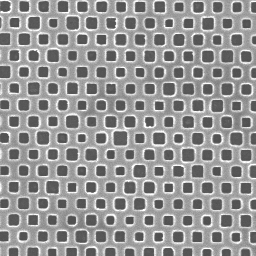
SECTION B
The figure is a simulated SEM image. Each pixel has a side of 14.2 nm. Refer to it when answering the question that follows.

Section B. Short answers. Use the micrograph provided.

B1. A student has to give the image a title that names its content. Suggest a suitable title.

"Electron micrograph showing a regular array of holes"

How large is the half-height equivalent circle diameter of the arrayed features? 159 nm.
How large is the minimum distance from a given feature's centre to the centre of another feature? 265 nm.